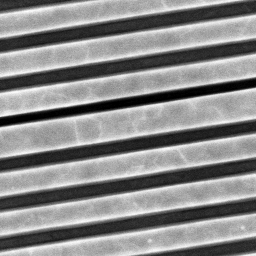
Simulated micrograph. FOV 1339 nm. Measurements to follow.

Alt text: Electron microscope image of parallel lines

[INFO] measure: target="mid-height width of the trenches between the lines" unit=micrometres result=0.0724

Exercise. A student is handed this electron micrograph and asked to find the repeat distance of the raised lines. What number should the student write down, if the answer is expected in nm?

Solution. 206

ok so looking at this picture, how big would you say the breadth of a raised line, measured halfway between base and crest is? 131 nm